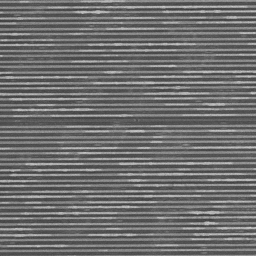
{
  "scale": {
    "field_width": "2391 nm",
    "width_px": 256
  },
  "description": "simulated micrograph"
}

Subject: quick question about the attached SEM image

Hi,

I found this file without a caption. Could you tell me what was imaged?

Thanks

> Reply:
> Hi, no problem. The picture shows parallel lines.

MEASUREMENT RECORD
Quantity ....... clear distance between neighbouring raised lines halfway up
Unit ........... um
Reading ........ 0.0339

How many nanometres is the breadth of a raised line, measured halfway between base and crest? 14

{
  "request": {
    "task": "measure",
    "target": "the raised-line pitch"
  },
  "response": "50.5 nanometres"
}